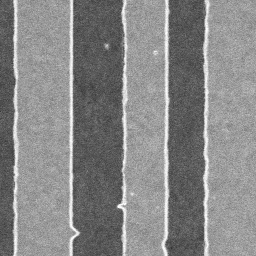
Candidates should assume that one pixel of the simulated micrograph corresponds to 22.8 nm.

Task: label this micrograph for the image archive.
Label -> one or a few lines or trenches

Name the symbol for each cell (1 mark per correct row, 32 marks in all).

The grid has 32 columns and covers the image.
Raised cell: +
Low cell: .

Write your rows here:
..+++++++.......+++++.....++++++
..+++++++......++++++.....++++++
..+++++++......++++++.....++++++
..+++++++.......+++++.....++++++
..+++++++.......+++++.....++++++
..+++++++.......+++++.....++++++
..+++++++.......+++++.....++++++
..+++++++.......+++++.....++++++
..+++++++.......+++++.....++++++
..+++++++.......+++++.....++++++
..+++++++.......+++++.....++++++
..+++++++.......+++++.....++++++
..+++++++.......+++++.....++++++
..+++++++......++++++.....++++++
..+++++++.......+++++.....++++++
..+++++++.......+++++.....++++++
..+++++++.......+++++.....++++++
..+++++++.......+++++.....++++++
..+++++++.......+++++.....++++++
..+++++++.......+++++.....++++++
..+++++++......++++++.....++++++
..+++++++......++++++.....++++++
..+++++++.......+++++.....++++++
..+++++++.......+++++.....++++++
..+++++++......++++++.....++++++
..+++++++......++++++.....++++++
..+++++++......++++++.....++++++
..+++++++.......+++++.....++++++
..+++++++.......+++++.....++++++
..+++++++.......+++++.....++++++
..+++++++......+++++......++++++
..+++++++.......+++++.....++++++